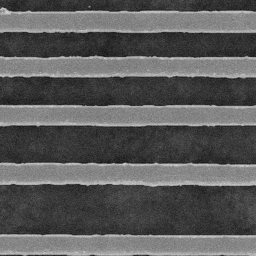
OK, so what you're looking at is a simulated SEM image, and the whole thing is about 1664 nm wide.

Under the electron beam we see lines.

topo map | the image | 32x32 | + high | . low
................................
++........++++.+.+++++...+.+++++
++++++++++++++++++++++++++++++++
++++++++++++++++++++++++++++++++
................................
................................
................................
++++++++++++++++++++++++++++++++
++++++++++++++++++++++++++++++++
.+....++++++++............+++++.
................................
................................
................................
++++++++++++++++++++++++++++++++
++++++++++++++++++++++++++++++++
++++++++++++++++++++++++++++++++
................................
................................
................................
................................
++.+++++++.+...+...+............
++++++++++++++++++++++++++++++++
++++++++++++++++++++++++++++++++
................................
................................
................................
................................
................................
................................
++++++++++++++++++++++++++++++++
++++++++++++++++++++++++++++++++
++++++++++++++++++++++++++++++++